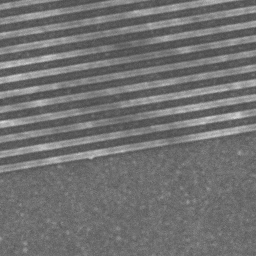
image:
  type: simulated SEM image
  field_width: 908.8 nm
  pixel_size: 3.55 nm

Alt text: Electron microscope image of parallel lines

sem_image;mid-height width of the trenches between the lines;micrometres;0.0324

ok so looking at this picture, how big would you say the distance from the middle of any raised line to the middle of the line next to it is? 51.7 nm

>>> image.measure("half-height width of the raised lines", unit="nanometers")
19.7